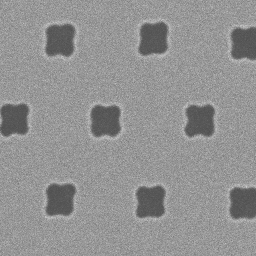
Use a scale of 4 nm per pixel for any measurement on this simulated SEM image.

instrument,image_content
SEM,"holes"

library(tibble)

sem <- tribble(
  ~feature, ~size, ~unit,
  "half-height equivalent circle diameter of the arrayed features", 131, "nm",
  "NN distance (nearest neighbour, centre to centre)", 366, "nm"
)